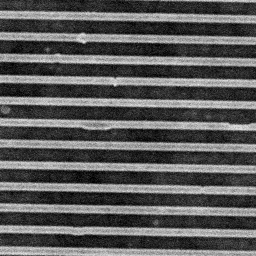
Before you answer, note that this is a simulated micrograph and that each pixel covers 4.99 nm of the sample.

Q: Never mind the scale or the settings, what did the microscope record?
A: parallel lines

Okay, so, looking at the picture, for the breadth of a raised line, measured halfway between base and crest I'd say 0.0362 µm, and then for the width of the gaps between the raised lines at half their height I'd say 71.7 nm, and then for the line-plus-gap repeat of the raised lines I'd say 0.107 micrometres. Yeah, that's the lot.